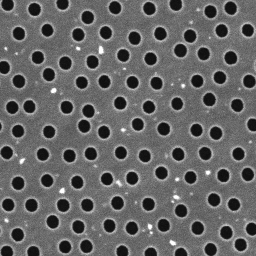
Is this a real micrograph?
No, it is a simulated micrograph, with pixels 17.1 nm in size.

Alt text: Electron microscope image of a regular array of holes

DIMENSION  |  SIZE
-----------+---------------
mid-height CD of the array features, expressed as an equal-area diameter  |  222 nm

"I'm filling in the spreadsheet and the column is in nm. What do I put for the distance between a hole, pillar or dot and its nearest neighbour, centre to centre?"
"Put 389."